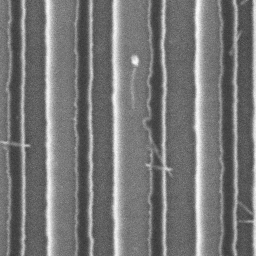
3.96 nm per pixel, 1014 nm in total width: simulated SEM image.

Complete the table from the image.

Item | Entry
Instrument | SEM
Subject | lines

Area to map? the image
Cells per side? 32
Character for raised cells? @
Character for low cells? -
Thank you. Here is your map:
@@@---@@@@@---@@@@@@-----@@@@---
@@@---@@@@@---@@@@@@-----@@@@---
@@@---@@@@@---@@@@@@-----@@@@---
@@@---@@@@@---@@@@@@-----@@@@---
@@@---@@@@@---@@@@@@-----@@@@@--
@@@---@@@@@---@@@@@@-----@@@@@--
@@@---@@@@@---@@@@@@-----@@@@---
@@@---@@@@@---@@@@@@-----@@@@---
@@@---@@@@@---@@@@@@-----@@@@@--
@@@---@@@@@---@@@@@@@----@@@@---
@@@---@@@@@---@@@@@@@----@@@@---
@@@---@@@@@---@@@@@@@----@@@@---
@@@---@@@@@---@@@@@@-----@@@@---
@@@---@@@@@---@@@@@@-----@@@@---
@@@---@@@@@---@@@@@@-----@@@@---
@@@---@@@@@---@@@@@@-----@@@@---
@@@---@@@@@---@@@@@@-----@@@@---
@@@---@@@@@---@@@@@@-----@@@@---
@@@---@@@@@---@@@@@@-----@@@@---
@@@---@@@@@---@@@@@@-----@@@@---
@@@---@@@@@---@@@@@@@----@@@@---
@@@---@@@@@---@@@@@@@----@@@@---
@@@---@@@@@---@@@@@@-----@@@@---
@@@---@@@@@---@@@@@@-----@@@@---
@@@---@@@@@---@@@@@@@----@@@@@--
@@@---@@@@@---@@@@@@@----@@@@---
@@@---@@@@@---@@@@@@@----@@@@---
@@@---@@@@@---@@@@@@@----@@@@---
@@@---@@@@@---@@@@@@@----@@@@---
@@@---@@@@@---@@@@@@@----@@@@---
@@@---@@@@@---@@@@@@@----@@@@---
@@@---@@@@@----@@@@@@----@@@@---